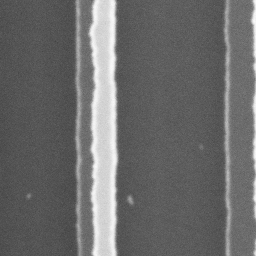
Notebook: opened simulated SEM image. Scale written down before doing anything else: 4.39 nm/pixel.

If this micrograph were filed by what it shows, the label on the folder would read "lines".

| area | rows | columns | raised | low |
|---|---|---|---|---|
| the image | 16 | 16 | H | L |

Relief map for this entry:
LLLLLHHLLLLLLLHH
LLLLLHHLLLLLLLHH
LLLLLHHLLLLLLLHH
LLLLLHHLLLLLLLHH
LLLLLHHLLLLLLLHH
LLLLLHHLLLLLLLHH
LLLLLHHLLLLLLLHH
LLLLLHHLLLLLLLHH
LLLLLHHLLLLLLLHH
LLLLLHHLLLLLLLHH
LLLLLHHLLLLLLLHH
LLLLLHHLLLLLLLHH
LLLLLHHLLLLLLLHH
LLLLLHHLLLLLLLHH
LLLLLHHLLLLLLLHH
LLLLLHHLLLLLLLHH